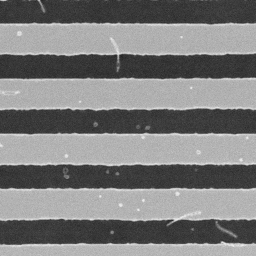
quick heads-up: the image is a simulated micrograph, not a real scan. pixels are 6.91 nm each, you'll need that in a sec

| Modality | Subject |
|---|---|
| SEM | lines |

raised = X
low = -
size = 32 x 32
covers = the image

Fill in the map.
--------------------------------
--------------------------------
--------------------------------
XXXXXXXXXXXXXXXXXXXXXXXXXXXXXXXX
XXXXXXXXXXXXXXXXXXXXXXXXXXXXXXXX
XXXXXXXXXXXXXXXXXXXXXXXXXXXXXXXX
XXXXXXXXXXXXXXXXXXXXXXXXXXXXXXXX
--------------------------------
--------------------------------
--------------------------------
XXXXXXXXXXXXXXXXXXXXXXXXXXXXXXXX
XXXXXXXXXXXXXXXXXXXXXXXXXXXXXXXX
XXXXXXXXXXXXXXXXXXXXXXXXXXXXXXXX
XXXXXXXXXXXXXXXXXXXXXXXX--XXXXXX
--------------------------------
--------------------------------
--------------------------------
XXXXXXXXXXXXXXXXXXXXXXXXXXXXXXXX
XXXXXXXXXXXXXXXXXXXXXXXXXXXXXXXX
XXXXXXXXXXXXXXXXXXXXXXXXXXXXXXXX
XXXXXX---XXXXXXXX-XX----XXX---X-
--------------------------------
--------------------------------
--------------------------------
XXXXXXXXXXXXXXXXXXXXXXXXXXXXXXXX
XXXXXXXXXXXXXXXXXXXXXXXXXXXXXXXX
XXXXXXXXXXXXXXXXXXXXXXXXXXXXXXXX
X---------------XXX--XX---------
--------------------------------
--------------------------------
----------X--X--X-X----X-X-XXX--
XXXXXXXXXXXXXXXXXXXXXXXXXXXXXXXX